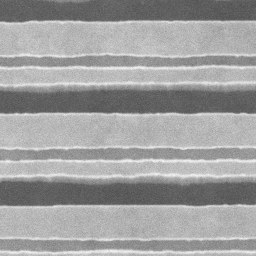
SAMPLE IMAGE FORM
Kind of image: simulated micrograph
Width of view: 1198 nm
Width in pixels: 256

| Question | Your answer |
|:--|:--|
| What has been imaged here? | lines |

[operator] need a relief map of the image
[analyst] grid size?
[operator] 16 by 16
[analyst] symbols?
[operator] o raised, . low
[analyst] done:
................
oooooooooooooooo
oooooooooooooooo
oooooooooooooooo
oooooooooooooooo
................
................
oooooooooooooooo
oooooooooooooooo
oooooooooooooooo
oooooooooooooooo
................
................
oooooooooooooooo
oooooooooooooooo
oooooooooooooooo